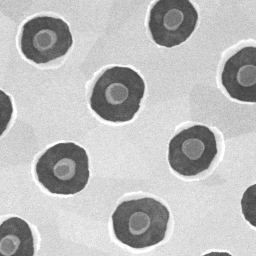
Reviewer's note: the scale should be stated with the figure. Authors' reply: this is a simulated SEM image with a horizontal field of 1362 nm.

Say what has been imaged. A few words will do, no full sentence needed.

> ring-shaped grooves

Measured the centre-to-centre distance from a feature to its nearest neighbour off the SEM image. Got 477 nm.